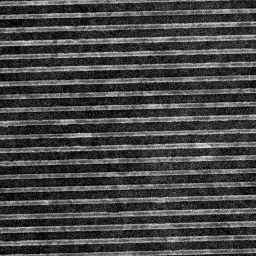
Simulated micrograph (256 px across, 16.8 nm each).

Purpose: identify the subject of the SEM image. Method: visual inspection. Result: parallel lines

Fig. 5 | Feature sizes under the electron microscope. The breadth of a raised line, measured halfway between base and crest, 62.8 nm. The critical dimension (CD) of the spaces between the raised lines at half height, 157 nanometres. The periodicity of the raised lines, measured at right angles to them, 223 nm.